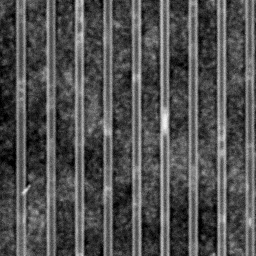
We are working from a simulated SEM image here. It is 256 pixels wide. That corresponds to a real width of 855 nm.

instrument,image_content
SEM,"parallel lines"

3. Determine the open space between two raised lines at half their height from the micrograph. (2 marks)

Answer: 20.4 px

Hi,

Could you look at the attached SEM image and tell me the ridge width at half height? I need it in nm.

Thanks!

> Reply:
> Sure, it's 25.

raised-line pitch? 95.6 nanometres